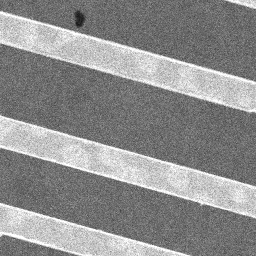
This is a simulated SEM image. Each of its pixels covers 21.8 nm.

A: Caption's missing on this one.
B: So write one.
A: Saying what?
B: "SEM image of one or a few lines or trenches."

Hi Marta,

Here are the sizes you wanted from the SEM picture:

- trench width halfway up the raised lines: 1580 nanometres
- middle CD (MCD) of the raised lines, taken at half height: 604 nm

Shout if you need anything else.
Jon